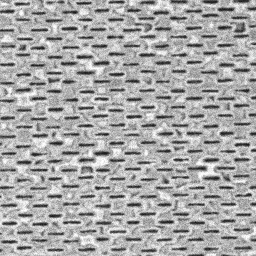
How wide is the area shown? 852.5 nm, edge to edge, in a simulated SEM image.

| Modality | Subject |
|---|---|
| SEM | a regular array of holes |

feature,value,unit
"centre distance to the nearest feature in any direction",52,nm